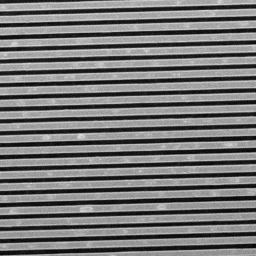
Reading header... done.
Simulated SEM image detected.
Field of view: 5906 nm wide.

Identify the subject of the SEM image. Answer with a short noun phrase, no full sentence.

parallel lines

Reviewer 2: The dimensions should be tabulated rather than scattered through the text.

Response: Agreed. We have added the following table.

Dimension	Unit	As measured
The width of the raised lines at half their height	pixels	6.75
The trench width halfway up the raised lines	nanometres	115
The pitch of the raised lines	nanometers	276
